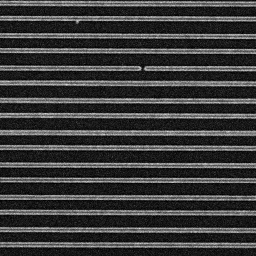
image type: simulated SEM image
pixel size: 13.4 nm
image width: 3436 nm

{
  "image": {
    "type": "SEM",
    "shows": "parallel lines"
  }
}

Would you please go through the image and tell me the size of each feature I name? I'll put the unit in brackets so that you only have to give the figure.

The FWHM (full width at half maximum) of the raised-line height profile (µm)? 0.0487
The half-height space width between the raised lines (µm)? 0.161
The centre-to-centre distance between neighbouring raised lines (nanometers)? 216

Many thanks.